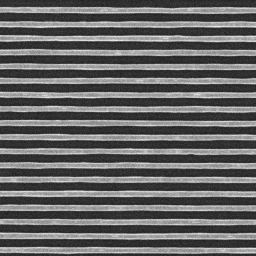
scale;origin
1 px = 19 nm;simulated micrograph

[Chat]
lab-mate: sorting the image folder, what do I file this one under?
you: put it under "parallel lines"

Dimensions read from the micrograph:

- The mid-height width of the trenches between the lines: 169 nm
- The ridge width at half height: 99.7 nanometres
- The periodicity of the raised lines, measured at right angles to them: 268 nanometres